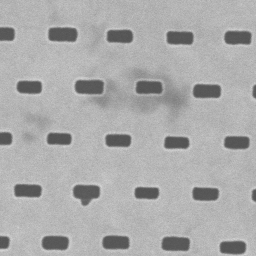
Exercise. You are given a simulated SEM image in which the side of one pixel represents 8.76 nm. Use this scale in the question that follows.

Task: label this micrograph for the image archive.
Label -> a regular array of holes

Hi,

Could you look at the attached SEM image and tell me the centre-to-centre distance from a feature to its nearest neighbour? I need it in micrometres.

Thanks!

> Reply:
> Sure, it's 0.511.